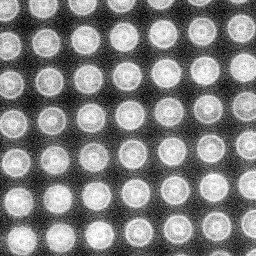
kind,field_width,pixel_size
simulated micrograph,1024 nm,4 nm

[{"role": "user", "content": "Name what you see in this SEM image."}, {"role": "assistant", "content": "an array of small figures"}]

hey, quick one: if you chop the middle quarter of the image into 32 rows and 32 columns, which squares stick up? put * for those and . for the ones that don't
**************...******.....****
****....*****.....*****..*...***
***......****..**..***...**..***
***..**..****..**..****.....****
***...*..****......****.....****
***......*****....*******.******
****....************************
********************************
********************************
************************....****
******.*******.....*****.....***
****.....*****.....****..**..***
****......***...**..***..**..***
****..**..***...*...****.....***
****......****.....*****....****
****.....******...**************
******..************************
********************************
********************************
*****************.*******....***
******...******....*****......**
*****.....****......****..**..**
****...*...***..**..****..**..**
.***...*...***......*****.....**
.****.....*****.....******...***
.****.....******..**************
*******.************************
********************************
********************************
*****************..*******....**
******....******....*****......*
.****......****......****..**..*